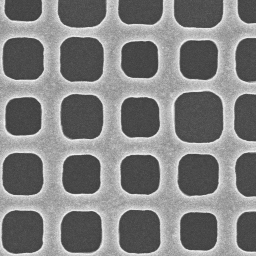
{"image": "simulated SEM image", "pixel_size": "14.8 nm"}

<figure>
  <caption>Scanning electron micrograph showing a regular array of holes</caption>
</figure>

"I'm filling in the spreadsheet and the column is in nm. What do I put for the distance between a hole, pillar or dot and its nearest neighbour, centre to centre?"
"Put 848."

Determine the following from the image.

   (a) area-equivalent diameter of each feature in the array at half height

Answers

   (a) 657 nm